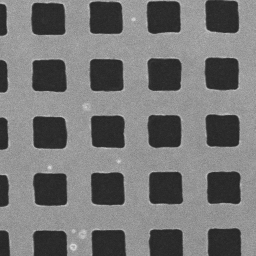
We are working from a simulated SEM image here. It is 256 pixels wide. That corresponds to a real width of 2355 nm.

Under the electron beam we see a regular array of holes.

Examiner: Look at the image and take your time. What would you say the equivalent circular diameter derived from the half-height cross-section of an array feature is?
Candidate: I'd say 335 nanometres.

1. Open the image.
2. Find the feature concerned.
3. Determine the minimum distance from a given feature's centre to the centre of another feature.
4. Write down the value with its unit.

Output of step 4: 523 nm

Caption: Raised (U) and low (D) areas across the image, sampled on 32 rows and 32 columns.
UUUUDDDDUUUDDDDUUUDDDDUUUUDDDDUU
DUUUDDDDUUUDDDDUUUDDDDDUUUDDDDUU
DUUUDDDDUUUDDDDUUUDDDDDUUUDDDDUU
DUUUDDDDUUUDDDDUUUDDDDDUUUDDDDUU
UUUUUUUUUUUUUUUUUUUUUUUUUUUUUUUU
UUUUUUUUUUUUUUUUUUUUUUUUUUUUUUUU
UUUUUUUUUUUUUUUUUUUUUUUUUUUUUUUU
UUUUUDDUUUUUDDDUUUUDDDUUUUDDDUUU
DUUUDDDDUUUDDDDUUUDDDDDUUUDDDDUU
DUUUDDDDUUUDDDDUUUUDDDDUUUDDDDUU
DUUUDDDDUUUDDDDDUUDDDDDUUUDDDDUU
UUUUUUUUUUUUUUUUUUUUUUUUUUUUUUUU
UUUUUUUUUUUUUUUUUUUUUUUUUUUUUUUU
UUUUUUUUUUUUUUUUUUUUUUUUUUUUUUUU
UUUUUUUUUUUUDDDUUUUDDDUUUUDDDUUU
DUUUDDDDUUUDDDDDUUDDDDDUUUDDDDUU
DUUUDDDDUUUDDDDUUUDDDDDUUUDDDDUU
DUUUDDDDUUUDDDDDUUUDDDDUUUDDDDUU
DUUUUDDDUUUUUUUUUUUUUDUUUUUUUUUU
UUUUUUUUUUUUUUUUUUUUUUUUUUUUUUUU
UUUUUUUUUUUUUUUUUUUUUUUUUUUUUUUU
UUUUUUUUUUUUUUUUUUUDDDUUUUUDDUUU
DUUUDDDDUUUDDDDDUUUDDDDUUUDDDDUU
DUUUDDDDUUUDDDDDUUUDDDDUUUDDDDUU
DUUUDDDDUUUDDDDDUUUDDDDUUUDDDDUU
DUUUUDDDUUUUDDDUUUUDDDUUUUUUUUUU
UUUUUUUUUUUUUUUUUUUUUUUUUUUUUUUU
UUUUUUUUUUUUUUUUUUUUUUUUUUUUUUUU
UUUUUUUUUUUUUUUUUUUUUUUUUUUUDUUU
DUUUDDDDUUUDDDDDUUUDDDDUUUDDDDUU
DUUUDDDDUUUDDDDDUUUDDDDUUUDDDDUU
DUUUDDDDUUUUDDDDUUUDDDDUUUDDDDUU